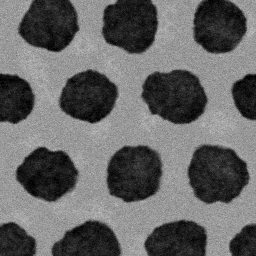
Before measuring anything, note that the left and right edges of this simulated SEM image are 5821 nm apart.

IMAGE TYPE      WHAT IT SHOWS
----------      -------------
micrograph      holes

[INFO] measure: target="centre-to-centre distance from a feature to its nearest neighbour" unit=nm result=1960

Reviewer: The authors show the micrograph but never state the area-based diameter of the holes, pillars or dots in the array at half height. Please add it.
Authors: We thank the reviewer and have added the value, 1.3 µm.